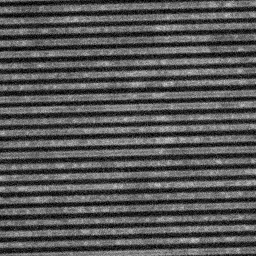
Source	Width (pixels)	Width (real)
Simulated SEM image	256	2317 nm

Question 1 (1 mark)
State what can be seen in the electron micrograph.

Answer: parallel lines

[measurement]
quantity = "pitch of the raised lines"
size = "101 nm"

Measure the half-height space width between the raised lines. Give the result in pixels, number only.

6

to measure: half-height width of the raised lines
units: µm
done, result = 0.0452